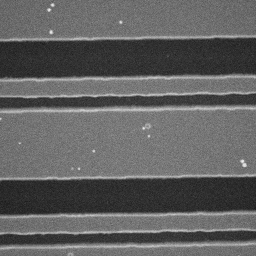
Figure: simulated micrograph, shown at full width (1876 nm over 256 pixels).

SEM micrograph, lines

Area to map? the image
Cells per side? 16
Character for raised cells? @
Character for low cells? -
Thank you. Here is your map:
@@@@@@@@@@@@@@@@
@@@@@@@@@@@@@@@@
@@--------------
----------------
----------------
@@@@@@@@@@@@@@@@
@@@@@@@@@@@@@@@@
@@@@@@@@@@@@@@@@
@@@@@@@@@@@@@@@@
@@@@@@@@@@@@@@@@
@@@@@@@@@@@@@@@@
----------------
----------------
---@@@@@@@@@@@@@
@@@@@@@@@@@@@@@@
@@@@@@@@@@@@@@@@